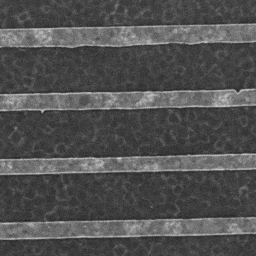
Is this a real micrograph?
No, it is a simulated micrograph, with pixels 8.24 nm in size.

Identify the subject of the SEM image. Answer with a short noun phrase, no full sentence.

one or a few lines or trenches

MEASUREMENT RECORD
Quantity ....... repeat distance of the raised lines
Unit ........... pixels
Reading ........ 64.2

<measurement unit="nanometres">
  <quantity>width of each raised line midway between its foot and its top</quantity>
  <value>132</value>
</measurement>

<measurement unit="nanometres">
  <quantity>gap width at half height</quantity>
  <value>402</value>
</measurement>